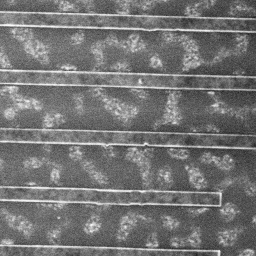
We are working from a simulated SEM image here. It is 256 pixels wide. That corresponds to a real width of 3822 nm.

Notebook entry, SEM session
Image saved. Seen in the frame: parallel lines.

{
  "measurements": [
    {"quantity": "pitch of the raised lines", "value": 871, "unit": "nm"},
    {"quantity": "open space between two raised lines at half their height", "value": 662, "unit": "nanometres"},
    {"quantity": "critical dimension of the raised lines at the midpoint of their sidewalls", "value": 13.4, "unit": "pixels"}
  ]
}